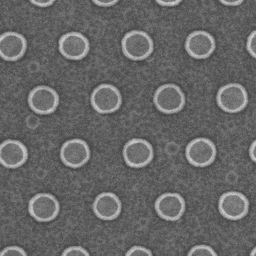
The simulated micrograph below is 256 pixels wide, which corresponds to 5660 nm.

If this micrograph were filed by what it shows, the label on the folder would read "a regular array of raised bodies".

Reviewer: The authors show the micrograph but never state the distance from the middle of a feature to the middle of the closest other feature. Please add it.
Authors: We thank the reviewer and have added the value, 1.37 µm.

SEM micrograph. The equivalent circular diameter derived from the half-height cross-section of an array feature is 0.593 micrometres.